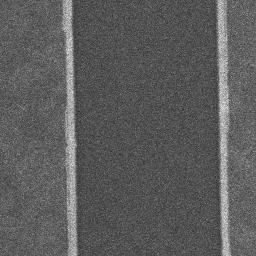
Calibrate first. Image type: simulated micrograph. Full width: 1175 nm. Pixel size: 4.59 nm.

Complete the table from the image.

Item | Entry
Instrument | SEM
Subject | one or a few lines or trenches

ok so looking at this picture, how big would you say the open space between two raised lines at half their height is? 697 nm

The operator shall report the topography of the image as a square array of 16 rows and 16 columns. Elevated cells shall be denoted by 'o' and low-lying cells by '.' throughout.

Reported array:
oooo..........oo
oooo..........oo
oooo..........oo
oooo..........oo
oooo..........oo
oooo..........oo
oooo..........oo
oooo..........oo
oooo..........oo
ooooo.........oo
oooo..........oo
oooo..........oo
ooooo.........oo
ooooo.........oo
ooooo.........oo
ooooo.........oo